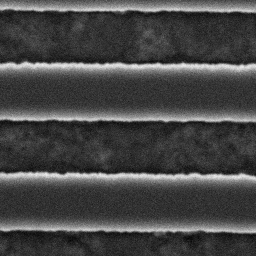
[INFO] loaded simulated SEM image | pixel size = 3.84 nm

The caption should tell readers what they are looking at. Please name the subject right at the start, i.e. lines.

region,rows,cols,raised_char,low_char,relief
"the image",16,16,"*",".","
****************
................
................
................
****************
****************
****************
****************
................
................
................
****************
****************
****************
..............**
................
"